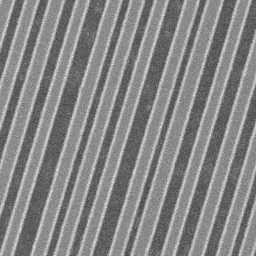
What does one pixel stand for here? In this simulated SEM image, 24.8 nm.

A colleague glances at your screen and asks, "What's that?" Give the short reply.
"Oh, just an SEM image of parallel lines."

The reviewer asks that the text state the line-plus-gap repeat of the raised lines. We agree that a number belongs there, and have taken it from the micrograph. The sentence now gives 639 nm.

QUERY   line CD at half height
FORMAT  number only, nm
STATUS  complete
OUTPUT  309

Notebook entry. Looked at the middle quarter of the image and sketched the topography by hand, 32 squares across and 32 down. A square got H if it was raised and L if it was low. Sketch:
HLLLLLHHHLLLHHHLLLHHHLLLLLHHHLLH
HLLLLLHHHLLLHHHLLLHHHLLLLHHHLLLH
HLLLLLHHHLLHHHLLLHHHLLLLLHHHLLLH
LLLLLHHHHLLHHHLLLHHHLLLLLHHHLLHH
LLLLLHHHLLLHHHLLLHHHLLLLHHHHLLHH
LLLLLHHHLLLHHHLLLHHLLLLLHHHLLLHH
LLLLHHHHLLHHHLLLHHHLLLLLHHHLLHHH
LLLLHHHLLLHHHLLLHHHLLLLHHHHLLHHH
LLLLHHHLLLHHHLLLHHLLLLLHHHLLLHHH
LLLLHHHLLHHHLLLHHHLLLLLHHHLLHHHH
LLLHHHLLLHHHLLLHHHLLLLLHHHLLHHHH
LLLHHHLLLHHHLLLHHHLLLLHHHLLLHHHL
LLLHHHLLHHHLLLHHHLLLLLHHHLLLHHHL
LLHHHLLLHHHLLLHHHLLLLLHHHLLHHHHL
LLHHHLLLHHHLLLHHHLLLLHHHHLLHHHLL
LHHHHLLLHHHLLHHHLLLLLHHHLLLHHHLL
LHHHHLLHHHLLLHHHLLLLLHHHLLHHHHLL
LHHHLLLHHHLLLHHHLLLLHHHHLLHHHHLL
LHHHLLLHHHLLLHHLLLLLHHHLLLHHHLLL
LHHHLLHHHLLLHHHLLLLLHHHLLHHHHLLL
HHHLLLHHHLLLHHHLLLLLHHHLLHHHHLLL
HHHLLLHHHLLLHHHLLLLHHHLLLHHHHLLL
HHHLLHHHLLLHHHLLLLLHHHLLLHHHLLLL
HHLLLHHHLLLHHHLLLLLHHHLLHHHHLLLL
HHLLLHHHLLLHHHLLLLHHHLLLHHHLLLLH
HHLLLHHHLLLHHLLLLLHHHLLLHHHLLLLH
HHLLHHHLLLHHHLLLLLHHHLLHHHHLLLLH
HLLLHHHLLLHHHLLLLHHHHLLHHHHLLLLH
HLLHHHHLLHHHLLLLLHHHLLLHHHLLLLHH
HLLHHHLLLHHHLLLLLHHHLLHHHHLLLLHH
LLLHHHLLLHHHLLLLLHHHLLHHHHLLLLHH
LLLHHHLLLHHHLLLLHHHLLLHHHLLLLLHH